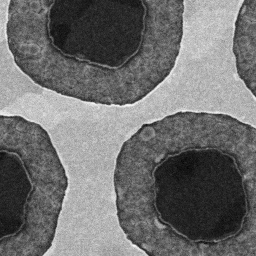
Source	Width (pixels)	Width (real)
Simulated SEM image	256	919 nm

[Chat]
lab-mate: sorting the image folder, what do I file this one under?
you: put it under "ring-shaped grooves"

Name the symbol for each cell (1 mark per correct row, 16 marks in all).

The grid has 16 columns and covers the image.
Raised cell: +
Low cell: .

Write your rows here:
+..++++++..++++.
...++++++..++++.
...++++++..++++.
+...++++...++++.
+..........++++.
+++.......+++++.
++++++..++++++++
..++++++++.....+
...+++++........
+...+++....+++..
++..+++...+++++.
++..+++...+++++.
++..+++...+++++.
+...+++...+++++.
+...++++...++++.
...++++++.......